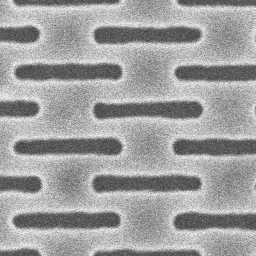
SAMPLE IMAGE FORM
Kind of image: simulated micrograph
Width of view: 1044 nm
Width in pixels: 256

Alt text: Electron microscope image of holes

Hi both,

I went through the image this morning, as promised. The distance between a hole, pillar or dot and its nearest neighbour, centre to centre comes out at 302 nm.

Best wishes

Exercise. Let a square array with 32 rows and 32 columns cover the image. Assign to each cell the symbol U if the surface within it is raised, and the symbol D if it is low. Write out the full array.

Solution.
UUDDDDDDDDDDDDDUUUUUUUDDDDDDDDDD
UUUUUUUUUUUUUUUUUUUUUUUUUUUUUUUU
UUUUUUUUUUUUUUUUUUUUUUUUUUUUUUUU
DDDDDUUUUUUUDDDDDDDDDDDDDUUUUUUU
DDDDDUUUUUUUDDDDDDDDDDDDDUUUUUUU
UUUUUUUUUUUUUDDDUUUDDDDUUUUUUUUU
UUUUUUUUUUUUUUUUUUUUUUUUUUUUUUUU
UUUUUUUUUUUUUUUUUUUUUUUUUUUUUUUU
UUDDDDDDDDDDDDDUUUUUUUDDDDDDDDDD
UUDDDDDDDDDDDDDUUUUUUUDDDDDDDDDD
UUUUUUUUUUUUUUUUUUUUUUUUUUUUUUUU
UUUUUUUUUUUUUUUUUUUUUUUUUUUUUUUU
UUDUUUUUUUUUUUUUUUUUUUDDUUUUUUUU
DDDDDUUUUUUUDDDDDDDDDDDDDUUUUUUU
DDDDUUUUUUUUDDDDDDDDDDDDDUUUUUUU
UUUUUUUUUUUUUUUUUUUUUUUUUUUUUUUU
UUUUUUUUUUUUUUUUUUUUUUUUUUUUUUUU
UUUDDDDDDDDDDDDUUUUUUUDDDDDDDDDD
UUDDDDDDDDDDDDDUUUUUUUDDDDDDDDDD
UUUUUUUUUUUUUUUUUUUUUUUUUUUDDDUU
UUUUUUUUUUUUUUUUUUUUUUUUUUUUUUUU
UUUUUUUUUUUUUUUUUUUUUUUUUUUUUUUU
DDDDDUUUUUUUDDDDDDDDDDDDDUUUUUUU
DDDDDUUUUUUDDDDDDDDDDDDDDUUUUUUU
UUUUUUUUUUUUUUUUUUUUUUUUUUUUUUUU
UUUUUUUUUUUUUUUUUUUUUUUUUUUUUUUU
UUUUUDUUUDDUDDUUUUUUUUUDDUUUUUUD
UUDDDDDDDDDDDDDUUUUUUUDDDDDDDDDD
UUDDDDDDDDDDDUUUUUUUUUDDDDDDDDDD
UUUUUUUUUUUUUUUUUUUUUUUUUUUUUUUU
UUUUUUUUUUUUUUUUUUUUUUUUUUUUUUUU
DDDDDUUUUUUUDDDDDDDDDDDDDUUUUUUU